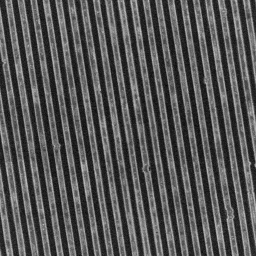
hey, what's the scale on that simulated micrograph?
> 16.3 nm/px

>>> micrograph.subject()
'parallel lines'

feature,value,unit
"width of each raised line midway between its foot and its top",80.5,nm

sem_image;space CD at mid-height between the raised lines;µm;0.121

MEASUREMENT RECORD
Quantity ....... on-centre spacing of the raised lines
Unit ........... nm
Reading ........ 201